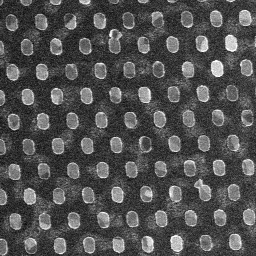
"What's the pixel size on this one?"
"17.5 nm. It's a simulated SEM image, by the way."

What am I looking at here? a regular array of raised bodies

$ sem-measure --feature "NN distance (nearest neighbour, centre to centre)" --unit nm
502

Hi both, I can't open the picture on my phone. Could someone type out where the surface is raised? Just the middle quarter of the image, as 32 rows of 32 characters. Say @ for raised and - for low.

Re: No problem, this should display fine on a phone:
-@@-----@@-----@@@----@@@-----@@
@@@-----@@-----@@@----@@@-----@@
@@@-----@@-----@@@----@@@-----@@
-@@------@----------------------
--------------------------------
--------------------------------
----@@------@@-----@@-----@@@---
----@@@-----@@-----@@-----@@@---
----@@@-----@@-----@@-----@@@---
-----@@-----@@------@-----------
--------------------------------
--------------------------------
-@@-----@@-----@@@-----@@-----@@
-@@-----@@-----@@@-----@@-----@@
-@@-----@@@----@@@-----@@-----@@
-@@-----@@@-----@@-----@@------@
--------------------------------
--------------------------------
------------@@-----@@------@@---
----@@@-----@@-----@@@----@@@---
-----@@-----@@-----@@@-----@@---
-----@@-----@@------@@-----@@---
--------------------------------
--------------------------------
-----------------------@@-----@@
-@@-----@@@-----@@-----@@-----@@
-@@-----@@@-----@@-----@@-----@@
-@@@-----@@-----@@-----@@------@
--------------------------------
--------------------------------
--------------------------------
-----@@-----@@-----@@@-----@@---